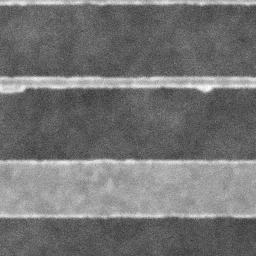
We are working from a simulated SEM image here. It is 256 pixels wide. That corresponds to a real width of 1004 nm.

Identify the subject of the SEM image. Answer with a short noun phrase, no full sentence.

lines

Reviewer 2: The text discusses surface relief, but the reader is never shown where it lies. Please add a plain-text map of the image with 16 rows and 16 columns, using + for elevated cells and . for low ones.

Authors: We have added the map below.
................
................
................
................
................
+...............
................
................
................
................
++++++++++++++++
++++++++++++++++
++++++++++++++++
++++++++++++++++
................
................